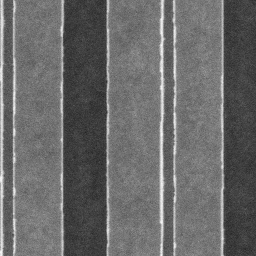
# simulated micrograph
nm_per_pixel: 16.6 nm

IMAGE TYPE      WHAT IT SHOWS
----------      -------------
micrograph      lines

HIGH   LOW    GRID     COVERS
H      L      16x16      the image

HHHHLLLHHHHHHHLL
HHHHLLLHHHHHHHLL
HHHHLLLHHHHHHHLL
HHHHLLLHHHHHHHLL
HHHHLLLHHHHHHHLL
HHHHLLLHHHHHHHLL
HHHHLLLHHHHHHHLL
HHHHLLLHHHHHHHLL
HHHHLLLHHHHHHHLL
HHHHLLLHHHHHHHLL
HHHHLLLHHHHHHHLL
HHHHLLLHHHHHHHLL
HHHHLLLHHHHHHHLL
HHHHLLLHHHHHHHLL
HHHHLLLHHHHHHHLL
HHHHLLLHHHHHHHLL